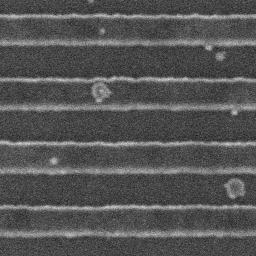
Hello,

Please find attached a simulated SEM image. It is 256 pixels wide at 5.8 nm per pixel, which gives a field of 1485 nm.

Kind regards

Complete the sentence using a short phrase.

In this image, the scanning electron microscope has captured lines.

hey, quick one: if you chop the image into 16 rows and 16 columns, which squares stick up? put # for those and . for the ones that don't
................
################
################
................
................
################
################
................
................
################
################
..............#.
................
################
################
................